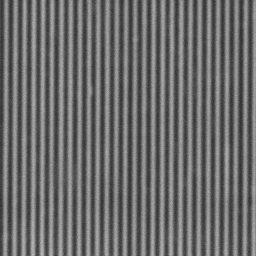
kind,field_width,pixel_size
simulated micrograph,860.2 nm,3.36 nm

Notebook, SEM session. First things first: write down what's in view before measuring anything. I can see parallel lines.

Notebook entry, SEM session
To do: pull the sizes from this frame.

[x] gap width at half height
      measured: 0.0185 microns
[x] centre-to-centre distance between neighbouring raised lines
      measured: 30.9 nm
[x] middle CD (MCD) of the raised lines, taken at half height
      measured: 12.2 nm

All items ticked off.